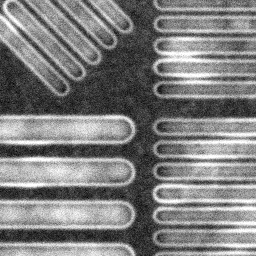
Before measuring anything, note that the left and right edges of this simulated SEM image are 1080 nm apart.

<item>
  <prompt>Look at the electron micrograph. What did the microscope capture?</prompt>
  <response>groups of lines, slits or small figures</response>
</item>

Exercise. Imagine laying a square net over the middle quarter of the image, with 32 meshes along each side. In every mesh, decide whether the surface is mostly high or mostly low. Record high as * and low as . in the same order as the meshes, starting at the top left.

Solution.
....*******************.........
.....******************.........
*....********************.......
***.****************************
********************************
.**********************.........
.**********************.........
************************........
********************************
********************************
********************************
********************************
********************************
...............*****************
.................******.........
.................******.........
.................******.........
.................********.......
................****************
...............***************..
***********************.........
***********************.........
***********************.........
********************************
................****************
.................*******........
.................******.........
.................******.........
.................********.......
................****************
*************************...****
***********************.........